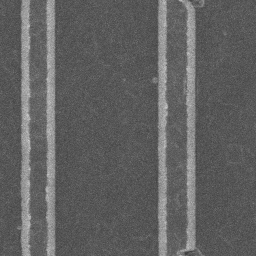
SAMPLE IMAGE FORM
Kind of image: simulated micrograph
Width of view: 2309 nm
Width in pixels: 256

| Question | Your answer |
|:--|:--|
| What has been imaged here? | one or a few lines or trenches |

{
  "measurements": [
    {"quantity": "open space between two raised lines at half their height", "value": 984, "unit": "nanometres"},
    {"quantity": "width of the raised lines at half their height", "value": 0.256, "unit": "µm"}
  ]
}